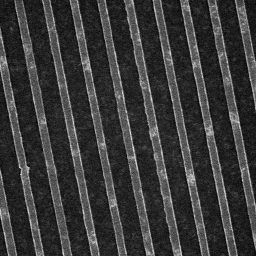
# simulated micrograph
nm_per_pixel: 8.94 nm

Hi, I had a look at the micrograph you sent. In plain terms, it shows parallel lines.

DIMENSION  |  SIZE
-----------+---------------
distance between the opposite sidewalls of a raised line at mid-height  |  69.1 nanometres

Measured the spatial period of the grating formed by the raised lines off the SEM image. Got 27.1 pixels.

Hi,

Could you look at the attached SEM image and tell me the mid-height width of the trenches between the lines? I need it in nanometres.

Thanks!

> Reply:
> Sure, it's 172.